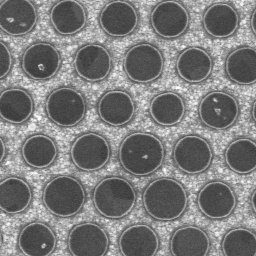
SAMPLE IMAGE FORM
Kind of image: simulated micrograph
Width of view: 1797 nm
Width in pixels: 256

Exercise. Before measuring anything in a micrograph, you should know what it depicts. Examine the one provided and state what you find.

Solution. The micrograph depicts a regular array of raised bodies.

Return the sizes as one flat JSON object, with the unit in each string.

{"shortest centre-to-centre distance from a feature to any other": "357 nm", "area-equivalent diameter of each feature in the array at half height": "254 nanometres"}